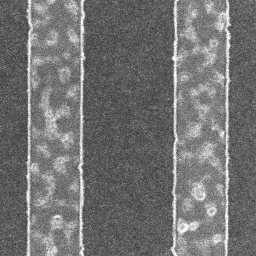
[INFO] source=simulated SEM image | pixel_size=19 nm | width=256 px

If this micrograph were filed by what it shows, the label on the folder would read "one or a few lines or trenches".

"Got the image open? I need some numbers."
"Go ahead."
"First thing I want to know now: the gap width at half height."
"986 nm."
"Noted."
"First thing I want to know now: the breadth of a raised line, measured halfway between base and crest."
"1780 nm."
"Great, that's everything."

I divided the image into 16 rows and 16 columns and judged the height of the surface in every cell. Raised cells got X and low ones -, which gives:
XX---XXXXXX---XX
XX---XXXXXX---XX
XX---XXXXXX---XX
XX---XXXXXX---XX
XX---XXXXXX---XX
XX---XXXXXX---XX
XX---XXXXXX---XX
XX---XXXXXX---XX
XX---XXXXXX---XX
XX---XXXXXX---XX
XX---XXXXXX---XX
XX---XXXXXX---XX
XX---XXXXXX---XX
XX---XXXXXX---XX
XX---XXXXXX---XX
XX---XXXXXX---XX